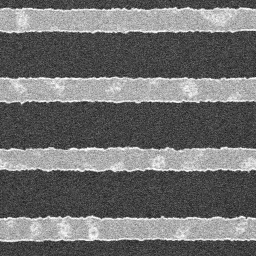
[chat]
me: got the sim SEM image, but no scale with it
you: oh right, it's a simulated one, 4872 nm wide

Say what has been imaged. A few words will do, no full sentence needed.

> one or a few lines or trenches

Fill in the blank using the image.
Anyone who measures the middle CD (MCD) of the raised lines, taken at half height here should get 0.412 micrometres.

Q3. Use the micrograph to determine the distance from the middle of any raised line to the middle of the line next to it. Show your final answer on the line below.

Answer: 1.32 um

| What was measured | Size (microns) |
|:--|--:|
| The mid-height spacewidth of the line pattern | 0.913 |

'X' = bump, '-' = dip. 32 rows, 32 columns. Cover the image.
--------------------------------
XXXXXXXXXXXXXXXXXXXXXXXXXXXXXXXX
XXXXXXXXXXXXXXXXXXXXXXXXXXXXXXXX
XXXXXXXXXXXXXXXXXXXXXXXXXXXXXXXX
--------------------------------
--------------------------------
--------------------------------
--------------------------------
--------------------------------
--------------------------------
XXXXXXXXXXXXXXXXXXXXXXXXXXXXXXXX
XXXXXXXXXXXXXXXXXXXXXXXXXXXXXXXX
XXXXXXXXXXXXXXXXXXXXXXXXXXXXXXXX
--------------------------------
--------------------------------
--------------------------------
--------------------------------
--------------------------------
--------------XXX---------------
XXXXXXXXXXXXXXXXXXXXXXXXXXXXXXXX
XXXXXXXXXXXXXXXXXXXXXXXXXXXXXXXX
--------------------------------
--------------------------------
--------------------------------
--------------------------------
--------------------------------
--------------------------------
XXXXXXXXXXXXXXXXXXXXXXXXXXXXXXXX
XXXXXXXXXXXXXXXXXXXXXXXXXXXXXXXX
XXXXXXXXXXXXXXXXXXXXXXXXXXXXXXXX
--------------------------------
--------------------------------